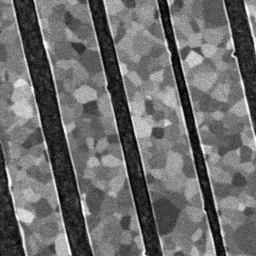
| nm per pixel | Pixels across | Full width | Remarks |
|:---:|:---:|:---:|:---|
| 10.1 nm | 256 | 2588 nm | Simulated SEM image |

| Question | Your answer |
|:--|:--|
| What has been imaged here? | one or a few lines or trenches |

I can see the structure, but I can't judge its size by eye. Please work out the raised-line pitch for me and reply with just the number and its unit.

0.675 micrometres